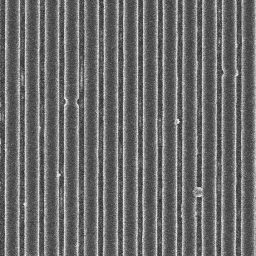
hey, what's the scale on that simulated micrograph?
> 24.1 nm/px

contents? parallel lines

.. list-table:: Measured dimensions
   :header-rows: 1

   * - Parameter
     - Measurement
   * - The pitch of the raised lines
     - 474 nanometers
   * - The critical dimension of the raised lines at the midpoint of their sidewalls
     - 0.34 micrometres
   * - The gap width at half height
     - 6.13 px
